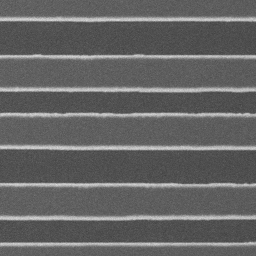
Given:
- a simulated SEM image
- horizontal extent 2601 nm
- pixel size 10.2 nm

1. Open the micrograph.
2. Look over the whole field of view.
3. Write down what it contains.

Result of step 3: lines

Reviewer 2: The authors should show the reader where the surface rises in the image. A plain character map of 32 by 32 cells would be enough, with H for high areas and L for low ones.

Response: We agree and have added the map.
HHHHHHHHHHHHHHHHHHHHHHHHHHHHHHHH
HHHHHHHHHHHHHHHHHHHHHHHHHHHHHHHH
LLLLLLLLLLLLLLLLLLLLLLLLLLLLLLLL
LLLLLLLLLLLLLLLLLLLLLLLLLLLLLLLL
LLLLLLLLLLLLLLLLLLLLLLLLLLLLLLLL
LLLLLLLLLLLLLLLLLLLLLLLLLLLLLLLL
LLLLLLLLLLLLLLLLLLLLLLLLLLLLLLLL
HHHHHHHHHHHHHHHHHHHHHHHHHHHHHHHH
HHHHHHHHHHHHHHHHHHHHHHHHHHHHHHHH
HHHHHHHHHHHHHHHHHHHHHHHHHHHHHHHH
HHHHHHHHHHHHHHHHHHHHHHHHHHHHHHHH
LLLLLLLLLLLLLLLLLLLLLLLLLLLLLLLL
LLLLLLLLLLLLLLLLLLLLLLLLLLLLLLLL
LLLLLLLLLLLLLLLLLLLLLLLLLLLLLLLL
HHHHHHHHHHHHHHHHHHHHHHHHHHHHHHHH
HHHHHHHHHHHHHHHHHHHHHHHHHHHHHHHH
HHHHHHHHHHHHHHHHHHHHHHHHHHHHHHHH
HHHHHHHHHHHHHHHHHHHHHHHHHHHHHHHH
LLLLLLLLHHHHLLHHHHHHHHHHHHHHHHHH
LLLLLLLLLLLLLLLLLLLLLLLLLLLLLLLL
LLLLLLLLLLLLLLLLLLLLLLLLLLLLLLLL
LLLLLLLLLLLLLLLLLLLLLLLLLLLLLLLL
LLLLLLLLLLLLLLLLLLLLLLLLLLLLLLLL
HHHHHHHHHHHHHHHHHHHHHHHHHHHHHHHH
HHHHHHHHHHHHHHHHHHHHHHHHHHHHHHHH
HHHHHHHHHHHHHHHHHHHHHHHHHHHHHHHH
HHHHHHHHHHHHHHHHHHHHHHHHHHHHHHHH
LLLLLLLLLLLLLLLLLLLLLLLLLLLLLLLL
LLLLLLLLLLLLLLLLLLLLLLLLLLLLLLLL
LLLLLLLLLLLLLLLLLLLLLLLLLLLLLLLL
LLLLLLHHHHHHHHHHHLLLHHHHHHHHHHHH
HHHHHHHHHHHHHHHHHHHHHHHHHHHHHHHH